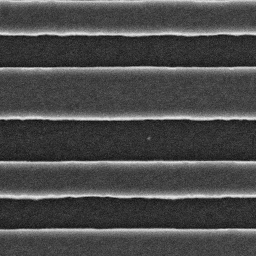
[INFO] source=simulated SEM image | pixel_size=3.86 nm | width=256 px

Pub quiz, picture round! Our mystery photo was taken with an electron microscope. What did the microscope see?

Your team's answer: lines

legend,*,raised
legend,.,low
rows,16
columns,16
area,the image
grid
****************
****************
................
................
****************
****************
****************
................
................
................
****************
****************
................
................
****************
****************